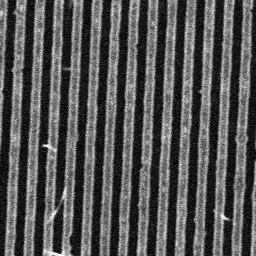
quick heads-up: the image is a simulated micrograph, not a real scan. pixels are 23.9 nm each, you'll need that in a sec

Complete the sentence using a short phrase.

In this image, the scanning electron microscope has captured parallel lines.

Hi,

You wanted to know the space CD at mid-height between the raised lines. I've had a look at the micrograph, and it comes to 269 nm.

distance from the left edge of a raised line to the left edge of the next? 18.9 px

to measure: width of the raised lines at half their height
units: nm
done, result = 200